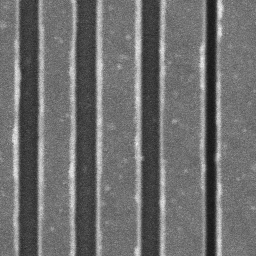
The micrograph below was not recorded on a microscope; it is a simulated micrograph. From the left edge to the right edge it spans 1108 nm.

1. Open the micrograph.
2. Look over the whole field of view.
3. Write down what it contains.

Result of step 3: one or a few lines or trenches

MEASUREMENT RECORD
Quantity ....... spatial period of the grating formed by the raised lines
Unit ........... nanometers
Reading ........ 272